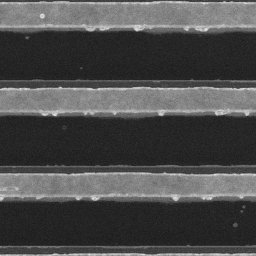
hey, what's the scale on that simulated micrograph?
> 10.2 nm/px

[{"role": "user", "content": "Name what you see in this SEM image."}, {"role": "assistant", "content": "lines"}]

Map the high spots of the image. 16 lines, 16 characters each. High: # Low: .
################
################
................
................
................
################
################
................
................
................
################
################
................
................
................
################